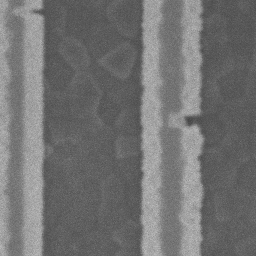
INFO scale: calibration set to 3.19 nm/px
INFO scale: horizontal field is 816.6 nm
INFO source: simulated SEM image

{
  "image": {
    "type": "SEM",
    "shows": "one or a few lines or trenches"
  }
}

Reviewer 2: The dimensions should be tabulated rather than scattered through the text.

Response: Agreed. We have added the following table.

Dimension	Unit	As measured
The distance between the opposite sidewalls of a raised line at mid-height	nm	136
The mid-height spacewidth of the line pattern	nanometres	369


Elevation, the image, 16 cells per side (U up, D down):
UUDDDDDDDUUUDDDD
UUDDDDDDDUUUDDDD
UUDDDDDDDUUUDDDD
UUDDDDDDDUUUDDDD
UUDDDDDDDUUUDDDD
UUDDDDDDDUUUDDDD
UUDDDDDDDUUUDDDD
UUDDDDDDDUUDDDDD
UUDDDDDDDUUUDDDD
UUDDDDDDDUUUDDDD
UUDDDDDDDUUUDDDD
UUDDDDDDDUUUDDDD
UUDDDDDDDUUUDDDD
UUDDDDDDDUUUDDDD
UUDDDDDDDUUUDDDD
UUDDDDDDDUUUDDDD